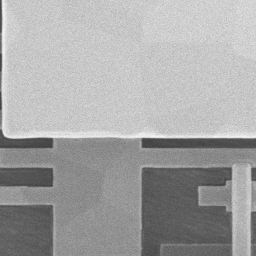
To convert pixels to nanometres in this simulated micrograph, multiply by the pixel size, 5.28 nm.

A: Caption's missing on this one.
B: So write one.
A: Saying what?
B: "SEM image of wiring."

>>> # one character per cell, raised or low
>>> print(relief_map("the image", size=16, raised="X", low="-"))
XXXXXXXXXXXXXXXX
XXXXXXXXXXXXXXXX
XXXXXXXXXXXXXXXX
XXXXXXXXXXXXXXXX
XXXXXXXXXXXXXXXX
XXXXXXXXXXXXXXXX
XXXXXXXXXXXXXXXX
XXXXXXXXXXXXXXXX
XXXXXXXXXXXXXXXX
----------------
----------------
----------------
----------------
----------------
----------------
----------------